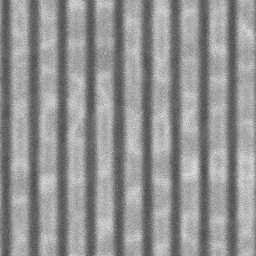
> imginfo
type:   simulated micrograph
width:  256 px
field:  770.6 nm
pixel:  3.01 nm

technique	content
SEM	parallel lines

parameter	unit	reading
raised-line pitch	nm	85.2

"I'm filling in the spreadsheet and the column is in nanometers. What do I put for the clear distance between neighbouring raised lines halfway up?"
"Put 38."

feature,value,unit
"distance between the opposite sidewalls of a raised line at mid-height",0.0482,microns